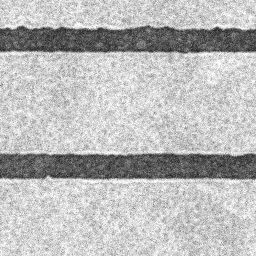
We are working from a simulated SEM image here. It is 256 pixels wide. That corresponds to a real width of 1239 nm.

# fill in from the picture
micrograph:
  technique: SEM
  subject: one or a few lines or trenches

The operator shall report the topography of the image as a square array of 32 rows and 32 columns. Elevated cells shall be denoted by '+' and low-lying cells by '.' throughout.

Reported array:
++++++++++++++++++++++++++++++++
++++++++++++++++++++++++++++++++
++++++++++++++++++++++++++++++++
...........+..++......+..+...++.
................................
................................
.......+........................
++++++++++++++++++++++++++++++++
++++++++++++++++++++++++++++++++
++++++++++++++++++++++++++++++++
++++++++++++++++++++++++++++++++
++++++++++++++++++++++++++++++++
++++++++++++++++++++++++++++++++
++++++++++++++++++++++++++++++++
++++++++++++++++++++++++++++++++
++++++++++++++++++++++++++++++++
++++++++++++++++++++++++++++++++
++++++++++++++++++++++++++++++++
++++++++++++++++++++++++++++++++
................................
................................
................................
+..+.++++++......+..++++++++....
++++++++++++++++++++++++++++++++
++++++++++++++++++++++++++++++++
++++++++++++++++++++++++++++++++
++++++++++++++++++++++++++++++++
++++++++++++++++++++++++++++++++
++++++++++++++++++++++++++++++++
++++++++++++++++++++++++++++++++
++++++++++++++++++++++++++++++++
++++++++++++++++++++++++++++++++